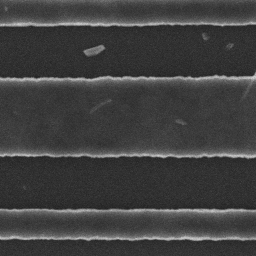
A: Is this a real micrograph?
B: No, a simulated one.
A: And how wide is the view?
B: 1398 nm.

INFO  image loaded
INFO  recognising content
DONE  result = lines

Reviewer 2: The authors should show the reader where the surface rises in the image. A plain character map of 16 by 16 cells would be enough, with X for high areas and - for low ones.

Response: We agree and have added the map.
XXXXXXXXXXXXXXXX
XXXXXXXXXXXXXXXX
----------------
----------------
----------------
XXXXXXXXXXXXXXXX
XXXXXXXXXXXXXXXX
XXXXXXXXXXXXXXXX
XXXXXXXXXXXXXXXX
XXXXXXXXXXXXXXXX
----------------
----------------
----------------
XXXXXXXXXXXXXXXX
XXXXXXXXXXXXXXXX
----------------